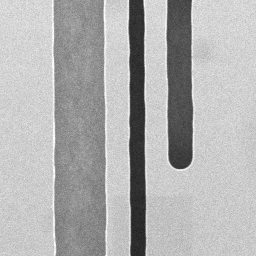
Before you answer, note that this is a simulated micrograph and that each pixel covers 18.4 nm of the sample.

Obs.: groups of lines, slits or small figures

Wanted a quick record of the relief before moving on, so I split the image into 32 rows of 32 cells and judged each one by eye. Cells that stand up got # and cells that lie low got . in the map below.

#######......###..###...########
#######......###..###...########
#######......###..###...########
#######......###..###...########
#######......###..###...########
#######......###..###...########
#######......###..###...########
#######......###..###...########
#######......###..###...########
#######......###..###...########
#######......###..###...########
#######......###..###...########
#######......###..###...########
#######......###..###...########
#######......###..###...########
#######......###..###...########
#######......###..###...########
#######......###..###...########
#######......###..###...########
#######......###..###...########
#######......###..###...########
#######......###..##############
#######......###..##############
#######......###..##############
#######......###..##############
#######......###..##############
#######......###..##############
#######......###..##############
#######......###..##############
#######......###..##############
#######......###..##############
#######......###..##############